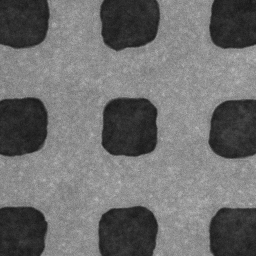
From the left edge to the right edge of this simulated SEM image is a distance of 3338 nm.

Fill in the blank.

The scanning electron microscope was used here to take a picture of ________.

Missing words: holes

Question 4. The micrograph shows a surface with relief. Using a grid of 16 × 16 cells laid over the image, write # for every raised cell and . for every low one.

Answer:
...###....###...
...###....###...
...###...####...
################
################
################
...####...####..
...###....###...
...###....###...
..#####..####...
################
################
################
...###....###...
...###....###...
...###....###...